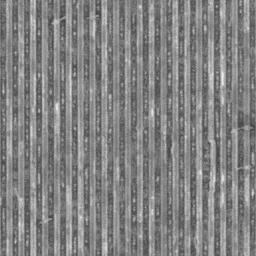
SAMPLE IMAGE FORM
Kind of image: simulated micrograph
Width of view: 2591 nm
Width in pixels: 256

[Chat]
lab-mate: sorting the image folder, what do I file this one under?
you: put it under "parallel lines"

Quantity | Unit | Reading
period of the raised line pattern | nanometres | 120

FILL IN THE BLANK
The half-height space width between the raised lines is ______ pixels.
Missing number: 6.88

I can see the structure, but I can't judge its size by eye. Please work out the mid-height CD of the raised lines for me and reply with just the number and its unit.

51.9 nanometres